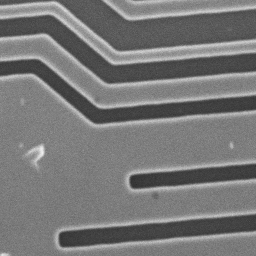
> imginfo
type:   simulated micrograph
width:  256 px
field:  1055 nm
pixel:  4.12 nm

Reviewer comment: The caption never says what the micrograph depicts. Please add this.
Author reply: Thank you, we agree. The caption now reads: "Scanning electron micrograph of groups of lines, slits or small figures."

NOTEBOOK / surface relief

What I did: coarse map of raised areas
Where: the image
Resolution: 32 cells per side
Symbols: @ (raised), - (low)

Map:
---@@@@------@@@@@@@@@@@@@@@@@@@
@@@@@@@@@------@@@@@@@@@@@@-----
-------@@@----------------------
---------@@---------------------
---@@@----@@--------------------
@@@@@@@----@@-------------@@@@@@
@@@@@@@@----@@@@@@@@@@@@@@@@@@@@
@----@@@@@---@@@@@@@@-----------
------@@@@@---------------------
-@@@---@@@@@---------------@@@@@
@@@@@@---@@@@@-@@@@@@@@@@@@@@@@@
@@@@@@@---@@@@@@@@@@@@@@@@@@@@@@
@@@@@@@@---@@@@@@@@@@@@@@-------
@@@@@@@@@---@@------------------
@@@@@@@@@@--------------@@@@@@@@
@@@@@@@@@@@@-@@@@@@@@@@@@@@@@@@@
@@@@@@@@@@@@@@@@@@@@@@@@@@@@@@@@
@@@@@@@@@@@@@@@@@@@@@@@@@@@@@@@@
@@@@@@@@@@@@@@@@@@@@@@@@@@@@@@@@
@@@@@@@@@@@@@@@@@@@@@@@@@@@@@@@@
@@@@@@@@@@@@@@@@@@@@@@@@@@@@@@--
@@@@@@@@@@@@@@@@@@@-------------
@@@@@@@@@@@@@@@@---------------@
@@@@@@@@@@@@@@@@@--@@@@@@@@@@@@@
@@@@@@@@@@@@@@@@@@@@@@@@@@@@@@@@
@@@@@@@@@@@@@@@@@@@@@@@@@@@@@@@@
@@@@@@@@@@@@@@@@@@@@@@@@@@@@@@@@
@@@@@@@@@@@@@@@@@@@@@@@---------
@@@@@@@@@@@@--------------------
@@@@@@@-------------------@@@@@@
@@@@@@@-------@@@@@@@@@@@@@@@@@@
@@@@@@@@@@@@@@@@@@@@@@@@@@@@@@@@